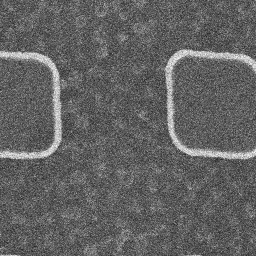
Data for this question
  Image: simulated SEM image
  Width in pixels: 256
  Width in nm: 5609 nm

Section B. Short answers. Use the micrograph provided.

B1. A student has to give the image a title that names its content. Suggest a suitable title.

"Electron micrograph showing raised bodies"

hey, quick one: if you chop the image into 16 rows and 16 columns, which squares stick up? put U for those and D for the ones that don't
DDDDDDDDDDDDDDDD
DDDDDDDDDDDDDDDD
DDDDDDDDDDDDDDDD
UUDDDDDDDDDUUUDD
UUUDDDDDDDDUUUUU
UUUUDDDDDDDUUUUU
UUUUDDDDDDDUUUUU
UUUUDDDDDDDUUUUU
UUUUDDDDDDDUUUUU
UUUDDDDDDDDDUUUU
DDDDDDDDDDDDDDDD
DDDDDDDDDDDDDDDD
DDDDDDDDDDDDDDDD
DDDDDDDDDDDDDDDD
DDDDDDDDDDDDDDDD
DDDDDDDDDDDDDDDD